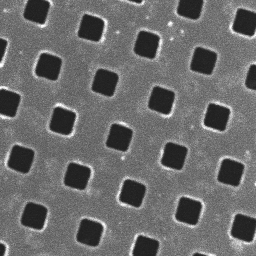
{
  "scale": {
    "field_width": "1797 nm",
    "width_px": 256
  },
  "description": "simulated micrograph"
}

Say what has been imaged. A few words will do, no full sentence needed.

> a regular array of holes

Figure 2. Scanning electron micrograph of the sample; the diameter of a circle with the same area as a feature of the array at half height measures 185 nm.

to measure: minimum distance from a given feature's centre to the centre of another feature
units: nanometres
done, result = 397